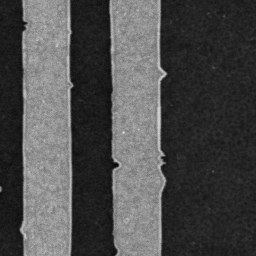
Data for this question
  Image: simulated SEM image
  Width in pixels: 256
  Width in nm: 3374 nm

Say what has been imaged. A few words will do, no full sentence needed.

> one or a few lines or trenches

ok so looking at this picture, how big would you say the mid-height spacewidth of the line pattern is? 572 nm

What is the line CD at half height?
0.61 micrometres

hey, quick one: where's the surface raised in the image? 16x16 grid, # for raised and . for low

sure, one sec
.###...###......
..##...###......
.###...###......
.###...###......
.###...###......
..##...###......
..##...###......
..##...###......
..##...###......
..##...###......
..##...###......
..##...###......
..##...###......
.###...###......
.###...###......
..##...###......